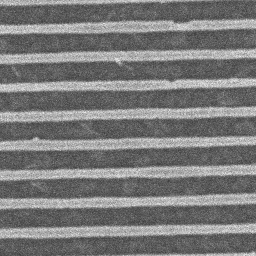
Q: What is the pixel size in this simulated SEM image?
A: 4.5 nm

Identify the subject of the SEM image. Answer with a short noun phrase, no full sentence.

parallel lines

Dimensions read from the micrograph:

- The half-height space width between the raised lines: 90.1 nanometres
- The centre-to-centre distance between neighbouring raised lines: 131 nm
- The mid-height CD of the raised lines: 41.1 nanometers